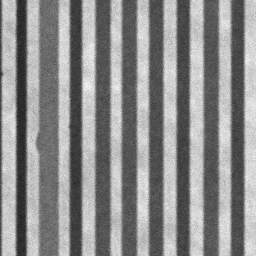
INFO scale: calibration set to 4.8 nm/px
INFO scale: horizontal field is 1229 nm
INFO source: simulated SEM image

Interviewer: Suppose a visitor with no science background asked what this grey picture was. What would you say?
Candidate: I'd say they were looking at parallel lines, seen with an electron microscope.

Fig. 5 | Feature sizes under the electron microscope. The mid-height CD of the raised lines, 55.3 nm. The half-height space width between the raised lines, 72.1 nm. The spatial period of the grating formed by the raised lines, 0.13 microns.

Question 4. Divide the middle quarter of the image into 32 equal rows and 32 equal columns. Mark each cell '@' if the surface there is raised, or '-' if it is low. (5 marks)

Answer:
@----@@@----@@----@@@----@@@----
@----@@@----@@----@@@----@@@----
@----@@@----@@----@@@----@@@----
@----@@@----@@----@@@----@@@----
@----@@@----@@----@@@----@@@----
@----@@@----@@----@@@----@@@----
@----@@@----@@----@@@----@@@----
@----@@@----@@----@@@----@@@----
@----@@@----@@----@@@----@@@----
@----@@@----@@----@@@----@@@----
@----@@@----@@----@@@----@@@----
@----@@@----@@----@@@----@@@----
@----@@@----@@----@@@----@@@----
@----@@@----@@----@@@----@@@----
@----@@@----@@----@@@----@@@----
@----@@@----@@----@@@----@@@----
@----@@@----@@----@@@----@@@----
@----@@@----@@----@@@----@@@----
@----@@@----@@----@@@----@@@----
@----@@@----@@----@@@----@@@----
@----@@@----@@----@@@----@@@----
@----@@@----@@----@@@----@@@----
@----@@@----@@----@@@----@@@----
@----@@@----@@----@@@----@@@----
@----@@@----@@----@@@----@@@----
@----@@@----@@----@@@----@@@----
@----@@@----@@----@@@----@@@----
@----@@@----@@----@@@----@@@----
@----@@@----@@----@@@----@@@----
@----@@@----@@----@@@----@@@----
@----@@@----@@----@@@----@@@----
@----@@@----@@----@@@----@@@----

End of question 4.